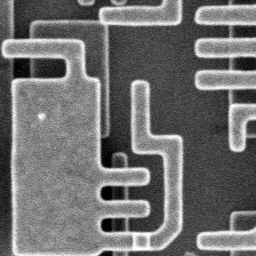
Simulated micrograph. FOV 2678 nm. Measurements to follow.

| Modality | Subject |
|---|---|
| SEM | wiring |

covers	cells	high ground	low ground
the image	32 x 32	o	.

....................ooo.........
.............oooooooooo..ooooooo
.............oooooooooo.oooooooo
................................
................................
oooooooooo..............oooooooo
ooooooooooo..............ooooooo
........ooo.....................
........ooo.....................
........ooo.............oooooooo
..oooooooooo.....o......oooooooo
..oooooooooo....ooo.............
..oooooooooo....ooo.............
..oooooooooo....ooo..........ooo
..oooooooooo....ooo..........ooo
..oooooooooo....ooo..........oo.
..oooooooooo....ooo..........oo.
..oooooooooo....ooooooo......oo.
..oooooooooo.....oooooo......o..
.ooooooooooo........ooo.........
.oooooooooooo........oo.........
.oooooooooooooooooo..oo.........
..ooooooooooooooooo..oo.........
..ooooooooooo........oo.........
..ooooooooooo........oo.........
..oooooooooooooooo...oo.........
..ooooooooooooooooo..oo.........
..ooooooooooo........oo.........
..ooooooooooo.......ooo.........
..oooooooooooooooooooo...ooooooo
..ooooooooooooooooooo....ooooooo
..ooooooooooo...................